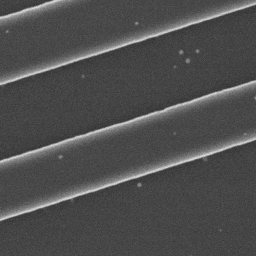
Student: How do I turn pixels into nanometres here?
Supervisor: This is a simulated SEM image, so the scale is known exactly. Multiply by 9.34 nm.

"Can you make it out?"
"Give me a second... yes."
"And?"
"lines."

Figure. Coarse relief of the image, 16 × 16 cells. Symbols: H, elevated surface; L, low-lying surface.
LLHHHHHHHHHHHHHL
HHHHHHHHHHHHLLLL
HHHHHHHHHLLLLLLL
HHHHHHLLLLLLLLLL
HHHLLLLLLLLLLLLL
LLLLLLLLLLLLLLHH
LLLLLLLLLLLHHHHH
LLLLLLLLHHHHHHHH
LLLLLHHHHHHHHHHH
LLHHHHHHHHHHHHLL
HHHHHHHHHHLLLLLL
HHHHHHHLLLLLLLLL
HHHHLLLLLLLLLLLL
HLLLLLLLLLLLLLLL
LLLLLLLLLLLLLLLL
LLLLLLLLLLLLLLLL